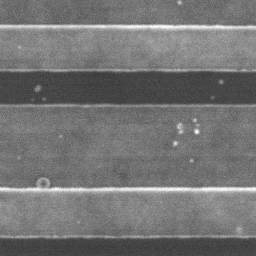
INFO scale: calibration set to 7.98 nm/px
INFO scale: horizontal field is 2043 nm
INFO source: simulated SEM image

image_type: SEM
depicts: lines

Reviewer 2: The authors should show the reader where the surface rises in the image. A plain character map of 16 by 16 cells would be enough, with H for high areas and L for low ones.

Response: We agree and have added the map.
LLLLLLLLLLLLLLLL
LLLLLLLLLLLLLLLL
HHHHHHHHHHHHHHHH
HHHHHHHHHHHHHHHH
HHHHHHHHHHHHHHHH
HHHHHHHHHHHHHHHH
HHHHHHHHHHHHHHHH
LLLLLLLLLLLLLLLL
LLLLLLLLLLLLLLLL
LLLLLLLLLLLLLLLL
LLLLLLLLLLLLLLLL
LLLLLLLLLLLLLLLL
HHHHHHHHHHHHHHHH
HHHHHHHHHHHHHHHH
HHHHHHHHHHHHHHHH
HHHHHHHHHHHHHHHH